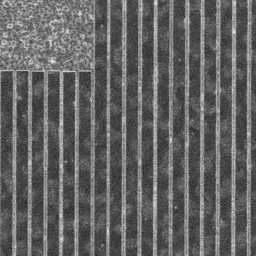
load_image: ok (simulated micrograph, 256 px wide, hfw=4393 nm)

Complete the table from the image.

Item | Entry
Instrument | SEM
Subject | parallel lines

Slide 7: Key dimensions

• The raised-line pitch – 268 nm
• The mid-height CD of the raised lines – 3 pixels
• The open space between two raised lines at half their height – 12.8 px